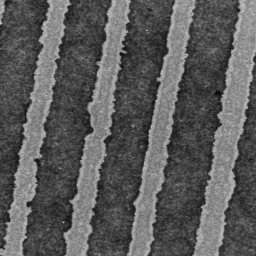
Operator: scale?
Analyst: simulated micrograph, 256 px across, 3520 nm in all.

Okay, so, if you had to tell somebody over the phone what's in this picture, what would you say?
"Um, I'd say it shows one or a few lines or trenches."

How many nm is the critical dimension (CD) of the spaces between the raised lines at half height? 639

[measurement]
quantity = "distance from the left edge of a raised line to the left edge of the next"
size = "872 nanometers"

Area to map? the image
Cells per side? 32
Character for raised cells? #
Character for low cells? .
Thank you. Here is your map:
......##......##......##......##
......##......##......##......##
......##......##......##......##
......##.....###.....###......##
.....###.....##......##......###
.....##......##......##......###
.....##......##......##......###
.....##......##......##......###
.....##......##.....###......##.
.....##.....###.....###......##.
....###.....##......##......###.
....##......##......##......###.
....##......##......##......###.
....##.....###......##......###.
....##.....###.....##.......##..
...##......###.....##.......##..
...##.......#......##......###..
...##......##......##......###..
...##......##......##......###..
...##.....###.....###......##...
...#......##......###......##...
..##......##......##.......##...
..##......##......##......###...
..##......##......##......###...
..##......##......#.......###...
..#......###.....##.......##....
.##......##......##.......##....
.##......##......##......###....
.##......##......##......###....
.##.....###......##......###....
.##.....###.....###......##.....
###.....###.....##......###.....